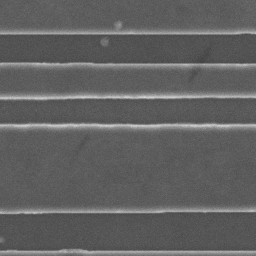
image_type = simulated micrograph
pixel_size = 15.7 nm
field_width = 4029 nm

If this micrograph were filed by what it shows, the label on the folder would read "lines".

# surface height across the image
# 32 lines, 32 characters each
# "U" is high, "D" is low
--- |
UUUUUUUUUUUUUUUUUUUUUUUUUUUUUUUU
UUUUUUUUUUUUUUUUUUUUUUUUUUUUUUUU
UUUUUUUUUUUUUUUUUUUUUUUUUUUUUUUU
UUUUUUUUUUUUUUUUUUUUUUUUUUUUUUUU
DDDDDDDDDDDDDDDDDDDDDDDDDDDDDDDD
DDDDDDDDDDDDDDDDDDDDDDDDDDDDDDDD
DDDDDDDDDDDDDDDDDDDDDDDDDDDDDDDD
DDDDDDDDDDDDDDDDDDDDDDDDDDDDDDDD
UUUUUUUUUUUUUUUUUUUUUUUUUUUUUUUU
UUUUUUUUUUUUUUUUUUUUUUUUUUUUUUUU
UUUUUUUUUUUUUUUUUUUUUUUUUUUUUUUU
UUUUUUUUUUUUUUUUUUUUUUUUUUUUUUUU
DDDDDDDDDDDDDDDDDDDDDDDDDDDDDDDD
DDDDDDDDDDDDDDDDDDDDDDDDDDDDDDDD
DDDDDDDDDDDDDDDDDDDDDDDDDDDDDDDD
DDDDDDDDUUDUDDDDDDDDDDDDDDDDDDDD
UUUUUUUUUUUUUUUUUUUUUUUUUUUUUUUU
UUUUUUUUUUUUUUUUUUUUUUUUUUUUUUUU
UUUUUUUUUUUUUUUUUUUUUUUUUUUUUUUU
UUUUUUUUUUUUUUUUUUUUUUUUUUUUUUUU
UUUUUUUUUUUUUUUUUUUUUUUUUUUUUUUU
UUUUUUUUUUUUUUUUUUUUUUUUUUUUUUUU
UUUUUUUUUUUUUUUUUUUUUUUUUUUUUUUU
UUUUUUUUUUUUUUUUUUUUUUUUUUUUUUUU
UUUUUUUUUUUUUUUUUUUUUUUUUUUUUUUU
UUUUUUUUUUUUUUUUUUUUUUUUUUUUUUUU
UUUUUUUUUUUUUUUUUUUUDDDDDDDDDDDD
DDDDDDDDDDDDDDDDDDDDDDDDDDDDDDDD
DDDDDDDDDDDDDDDDDDDDDDDDDDDDDDDD
DDDDDDDDDDDDDDDDDDDDDDDDDDDDDDDD
DDDDDDDDDDDDDDDDDDDDDDDDDDDDDDDD
UUUUUUUUUUUUUUUUUUUUUUUUUUUUUUUU